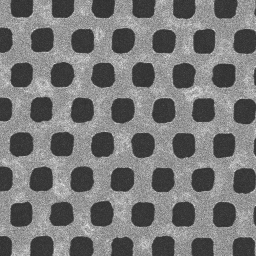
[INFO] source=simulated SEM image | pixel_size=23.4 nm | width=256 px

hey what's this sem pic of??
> a regular array of holes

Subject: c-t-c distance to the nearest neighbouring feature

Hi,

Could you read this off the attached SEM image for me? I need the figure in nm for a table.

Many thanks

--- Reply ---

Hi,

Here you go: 929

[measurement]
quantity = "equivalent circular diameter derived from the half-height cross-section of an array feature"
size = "592 nm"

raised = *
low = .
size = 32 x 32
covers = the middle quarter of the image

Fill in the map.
..*****.....******....******....
...****......****......****.....
...****......****......****.....
...****......****......****.....
..*****.....*****.....*****.....
.*******....******....******....
********************************
********************************
***..**********.********..******
**.....*****.....******....*****
**.....*****......****......****
**......****......****......****
**......****......****......****
**.....*****.....*****......****
**....*******...*******...******
********************************
********************************
..******....******....******....
..*****.....*****......****.....
..*****......****......****.....
..*****......****......****.....
..*****.....*****......****.....
..*****.....*****.....******....
*******************.*********.**
********************************
****..**************************
**.....*****.....******....*****
**.....*****......****.....*****
**.....*****......****......****
**.....*****......****......****
**.....*****.....*****.....*****
**.....*****....*******....*****